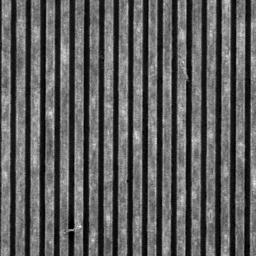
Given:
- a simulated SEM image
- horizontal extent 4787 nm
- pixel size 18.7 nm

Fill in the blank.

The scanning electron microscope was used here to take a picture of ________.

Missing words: parallel lines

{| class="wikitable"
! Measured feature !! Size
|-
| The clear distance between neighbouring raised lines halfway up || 110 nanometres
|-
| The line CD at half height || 161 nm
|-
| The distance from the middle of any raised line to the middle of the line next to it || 274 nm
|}